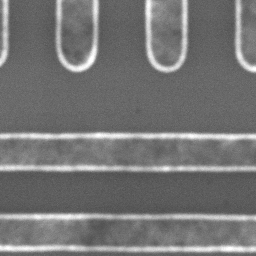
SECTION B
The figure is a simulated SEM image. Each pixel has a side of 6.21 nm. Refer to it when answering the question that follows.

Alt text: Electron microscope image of groups of lines, slits or small figures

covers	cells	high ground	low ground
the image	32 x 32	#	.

#......#####.......####.......##
#......#####.......####.......##
#......#####.......####.......##
#......#####.......####.......##
#......#####.......####.......##
#......#####.......####.......##
#......#####.......####.......##
........###........####.......##
.........#..........##.........#
................................
................................
................................
................................
................................
................................
................................
................................
################################
################################
################################
################################
................................
................................
................................
................................
................................
................................
################################
################################
################################
################################
................................